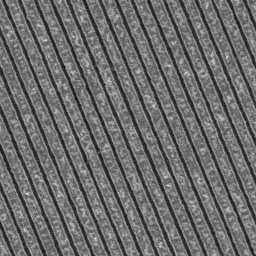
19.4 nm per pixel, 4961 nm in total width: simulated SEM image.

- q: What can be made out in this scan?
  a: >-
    parallel lines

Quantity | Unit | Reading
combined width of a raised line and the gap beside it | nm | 288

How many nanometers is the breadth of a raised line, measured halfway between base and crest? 208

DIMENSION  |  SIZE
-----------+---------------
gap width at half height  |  87.2 nm